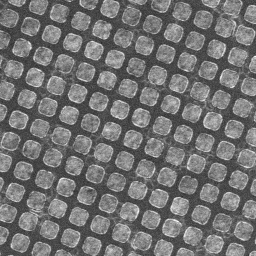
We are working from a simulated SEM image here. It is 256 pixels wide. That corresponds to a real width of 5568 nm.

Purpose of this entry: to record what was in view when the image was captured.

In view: a regular array of raised bodies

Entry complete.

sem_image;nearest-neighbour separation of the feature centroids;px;22.6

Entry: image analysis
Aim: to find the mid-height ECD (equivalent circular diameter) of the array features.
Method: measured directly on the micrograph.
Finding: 389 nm